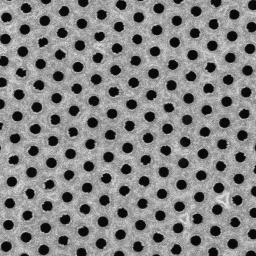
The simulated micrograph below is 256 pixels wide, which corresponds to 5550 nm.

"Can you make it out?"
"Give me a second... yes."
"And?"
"a regular array of holes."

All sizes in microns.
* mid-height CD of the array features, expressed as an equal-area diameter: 0.228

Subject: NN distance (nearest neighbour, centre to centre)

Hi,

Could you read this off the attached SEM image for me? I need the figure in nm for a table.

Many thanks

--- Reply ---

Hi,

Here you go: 463